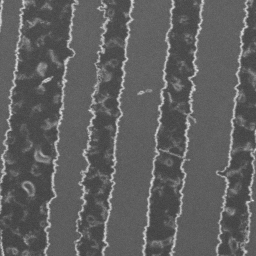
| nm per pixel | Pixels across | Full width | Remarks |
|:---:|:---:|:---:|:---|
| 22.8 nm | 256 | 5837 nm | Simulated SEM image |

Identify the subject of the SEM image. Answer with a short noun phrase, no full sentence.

one or a few lines or trenches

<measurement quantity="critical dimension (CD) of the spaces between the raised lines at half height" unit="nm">895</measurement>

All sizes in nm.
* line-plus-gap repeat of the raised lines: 1590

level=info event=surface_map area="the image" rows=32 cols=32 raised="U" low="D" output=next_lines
DDDUUUUUUDDDDUUUUDDDDDUUUDDDDDDU
DDDUUUUUUDDDDUUUDDDDDUUUUDDDDDDU
DDDUUUUUUDDDDUUUDDDDDUUUUDDDDDDU
DDUUUUUUUDDDDUUUDDDDDUUUUDDDDDDU
DDUUUUUUUDDDDUUUDDDDDUUUUDDDDDUU
DDUUUUUUUDDDDUUUDDDDDUUUUDDDDDUU
DDUUUUUUUDDDDUUUDDDDDUUUDDDDDDUU
DDUUUUUUDDDDUUUUDDDDDUUUDDDDDDUU
DDUUUUUUDDDDUUUDDDDDDUUUDDDDDDUU
DDUUUUUUDDDDUUUDDDDDDUUUDDDDDDUU
DDUUUUUUDDDDUUUDDDDDDUUUDDDDDDUU
DUUUUUUUDDDDUUUDDDDDUUUUDDDDDDUU
DUUUUUUUDDDDUUUDDDDDUUUUDDDDDUUU
DUUUUUUUDDDUUUUDDDDDUUUUDDDDDUUU
DUUUUUUUDDDDUUUDDDDDUUUUDDDDDUUU
DUUUUUUDDDDUUUUDDDDDUUUDDDDDDUUU
DUUUUUUDDDDUUUUDDDDDUUUDDDDDDUUU
DUUUUUUDDDDUUUDDDDDUUUUDDDDDDUUU
DUUUUUUDDDDUUUDDDDDUUUUDDDDDDUUU
UUUUUUUDDDDUUUDDDDDDUUUDDDDDDUUU
UUUUUUUDDDDUUUDDDDDUUUUDDDDDDUUU
UUUUUUUDDDDUUUDDDDDUUUUDDDDDUUUU
UUUUUUUDDDUUUUDDDDDUUUUDDDDDUUUU
UUUUUUUDDDUUUUDDDDDUUUUDDDDDUUUD
UUUUUUUDDDUUUUDDDDDUUUUDDDDDUUUD
UUUUUUDDDDUUUUDDDDDUUUUDDDDDUUUD
UUUUUUDDDDUUUUDDDDDUUUUDDDDDUUUD
UUUUUUDDDDUUUDDDDDDUUUDDDDDDUUUD
UUUUUUDDDDUUUDDDDDUUUUDDDDDDUUUD
UUUUUUDDDDUUUDDDDDUUUUDDDDDUUUUD
UUUUUUDDDUUUUDDDDDUUUUDDDDDUUUUD
UUUUUUDDDDUUUDDDDDUUUUDDDDDUUUUD